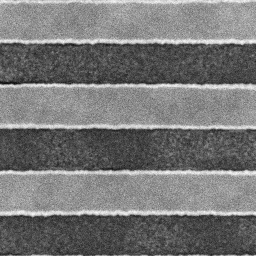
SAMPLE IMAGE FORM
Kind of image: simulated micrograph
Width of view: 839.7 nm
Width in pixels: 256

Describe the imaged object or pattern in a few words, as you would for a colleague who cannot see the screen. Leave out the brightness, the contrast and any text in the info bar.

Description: lines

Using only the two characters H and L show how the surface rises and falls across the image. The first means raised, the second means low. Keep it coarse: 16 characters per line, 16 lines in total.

HHHHHHHHHHHHHHHH
HHHHHHHHHHHHHHHH
HHHHHHHHHHHHHHHH
LLLLLLLLLLLLLLLL
LLLLLLLLLLLLLLLL
HHHHHHHHHHHHHHHH
HHHHHHHHHHHHHHHH
HHHHHHHHHHHHHHHH
LLLLLLLLLLLLLLLL
LLLLLLLLLLLLLLLL
LLLLLLLLLLLLLLLL
HHHHHHHHHHHHHHHH
HHHHHHHHHHHHHHHH
LLLLLLLLLLLLLLLL
LLLLLLLLLLLLLLLL
LLLLLLLLLLLLLLLL